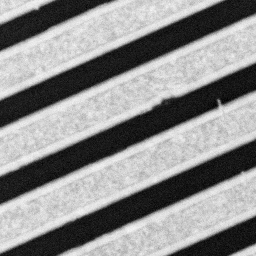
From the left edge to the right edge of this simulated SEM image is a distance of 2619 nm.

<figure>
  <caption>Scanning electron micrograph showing one or a few lines or trenches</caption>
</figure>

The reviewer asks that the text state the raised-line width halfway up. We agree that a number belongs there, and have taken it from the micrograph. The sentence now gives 353 nanometers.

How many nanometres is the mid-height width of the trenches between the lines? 363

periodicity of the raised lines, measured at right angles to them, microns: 0.717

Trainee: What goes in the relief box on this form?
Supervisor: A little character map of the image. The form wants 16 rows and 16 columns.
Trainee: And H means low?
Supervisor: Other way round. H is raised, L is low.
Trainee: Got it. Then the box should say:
HHLLLLLHHHHHLLLL
LLLLLHHHHHLLLLLH
LLHHHHHHLLLLLHHH
HHHHHLLLLLLHHHHH
HHHLLLLLLHHHHHLL
HLLLLLHHHHHHLLLL
LLLLHHHHHLLLLLLH
LLHHHHHLLLLLLHHH
HHHHHLLLLLHHHHHH
HHHLLLLLHHHHHLLL
LLLLLLHHHHHLLLLL
LLLLHHHHHLLLLLHH
LHHHHHHLLLLLHHHH
HHHHLLLLLLHHHHHL
HHLLLLLLHHHHHLLL
LLLLLLHHHHHLLLLL